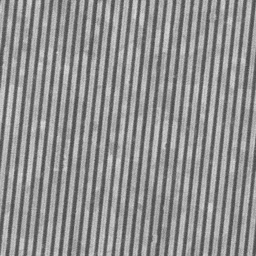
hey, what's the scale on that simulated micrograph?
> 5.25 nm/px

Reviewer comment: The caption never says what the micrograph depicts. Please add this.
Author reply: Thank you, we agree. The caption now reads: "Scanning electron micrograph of parallel lines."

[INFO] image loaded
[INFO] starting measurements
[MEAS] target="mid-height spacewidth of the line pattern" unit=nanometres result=26.7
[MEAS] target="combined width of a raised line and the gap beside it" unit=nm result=46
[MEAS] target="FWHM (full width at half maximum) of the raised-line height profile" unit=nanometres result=18.3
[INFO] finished